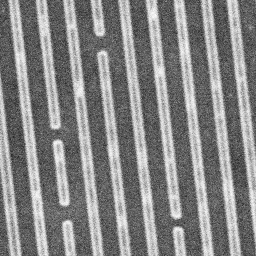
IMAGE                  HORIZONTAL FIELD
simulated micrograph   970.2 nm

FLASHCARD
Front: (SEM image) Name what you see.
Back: parallel lines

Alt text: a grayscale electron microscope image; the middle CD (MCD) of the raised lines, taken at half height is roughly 28.7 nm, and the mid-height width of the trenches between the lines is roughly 71.9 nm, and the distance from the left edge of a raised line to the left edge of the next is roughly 103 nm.